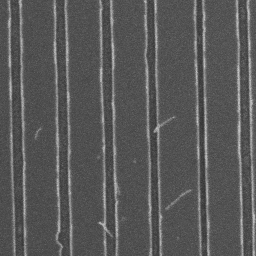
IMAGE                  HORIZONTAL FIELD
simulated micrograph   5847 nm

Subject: parallel lines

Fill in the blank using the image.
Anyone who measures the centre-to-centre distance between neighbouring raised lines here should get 45.6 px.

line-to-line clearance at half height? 226 nanometres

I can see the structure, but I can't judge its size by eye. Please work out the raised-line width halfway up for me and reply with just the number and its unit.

0.813 micrometres